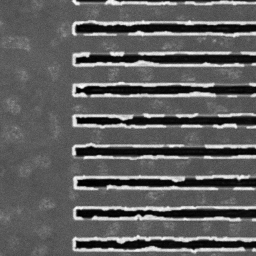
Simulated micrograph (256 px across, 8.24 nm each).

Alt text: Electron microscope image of parallel lines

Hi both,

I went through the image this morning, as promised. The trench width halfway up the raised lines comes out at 62.8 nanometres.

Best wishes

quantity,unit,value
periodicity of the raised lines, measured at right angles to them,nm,255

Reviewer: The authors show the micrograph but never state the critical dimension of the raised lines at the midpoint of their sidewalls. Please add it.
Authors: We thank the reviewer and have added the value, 188 nm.